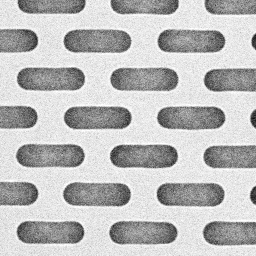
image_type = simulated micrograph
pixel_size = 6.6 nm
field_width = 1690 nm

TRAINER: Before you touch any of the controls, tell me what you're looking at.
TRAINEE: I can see groups of lines, slits or small figures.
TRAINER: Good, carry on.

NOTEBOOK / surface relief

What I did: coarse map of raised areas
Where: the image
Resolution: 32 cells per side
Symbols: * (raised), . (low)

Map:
**.........***........****......
***.......****........****......
********************************
********************************
.....***........****........****
.....***........****........***.
...******......******......*****
********************************
***.......*****......*******....
**.........***........****......
**........****........****......
***************************.***.
********************************
....*****.......****.......*****
.....***........****........***.
....****........****........***.
********************************
********************************
**........****........****......
**.........***........***.......
**........****........****......
********************************
********************************
.....***........****........****
.....***........****........***.
....*****.......****.......*****
********************************
********************************
**........****........***.......
**........****........***.......
****.....******......*****......
********************************